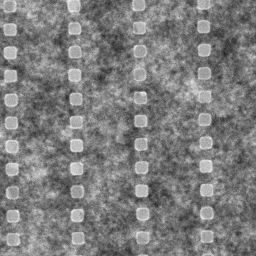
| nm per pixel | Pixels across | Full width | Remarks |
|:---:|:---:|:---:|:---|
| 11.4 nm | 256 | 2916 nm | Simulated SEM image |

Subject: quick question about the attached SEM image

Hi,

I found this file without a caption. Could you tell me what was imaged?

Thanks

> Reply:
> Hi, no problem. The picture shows a regular array of raised bodies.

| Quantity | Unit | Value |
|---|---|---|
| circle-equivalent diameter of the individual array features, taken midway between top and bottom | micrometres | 0.148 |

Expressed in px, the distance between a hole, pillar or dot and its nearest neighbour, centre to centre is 23.1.